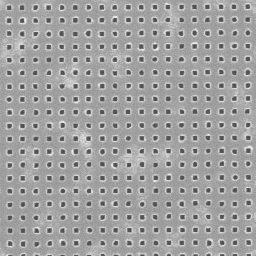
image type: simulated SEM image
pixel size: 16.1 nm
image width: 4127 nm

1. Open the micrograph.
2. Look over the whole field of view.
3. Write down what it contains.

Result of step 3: a regular array of holes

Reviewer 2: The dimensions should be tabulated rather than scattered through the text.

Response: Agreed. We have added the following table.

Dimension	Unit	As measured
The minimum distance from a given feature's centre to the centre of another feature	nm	205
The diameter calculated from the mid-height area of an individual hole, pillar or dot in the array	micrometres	0.0814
